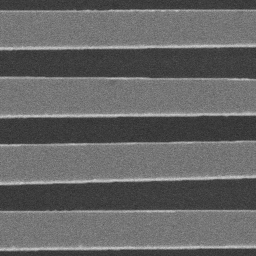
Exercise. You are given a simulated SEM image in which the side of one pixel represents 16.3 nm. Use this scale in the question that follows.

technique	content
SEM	lines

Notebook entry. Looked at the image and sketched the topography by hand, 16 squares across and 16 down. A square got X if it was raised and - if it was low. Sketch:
----------------
XXXXXXXXXXXXXXXX
XXXXXXXXXXXXXXXX
----------------
----------------
XXXXXXXXXXXXXXXX
XXXXXXXXXXXXXXXX
----------------
----------------
XXXXXXXXXXXXXXXX
XXXXXXXXXXXXXXXX
X---------------
----------------
XXXXXXXXXXXXXXXX
XXXXXXXXXXXXXXXX
XXXXXXXXXXXX----